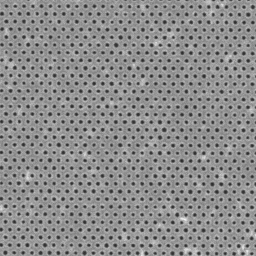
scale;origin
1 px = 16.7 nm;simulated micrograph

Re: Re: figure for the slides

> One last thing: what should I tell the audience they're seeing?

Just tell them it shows a regular array of holes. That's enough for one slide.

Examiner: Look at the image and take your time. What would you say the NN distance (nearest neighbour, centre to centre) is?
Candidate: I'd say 143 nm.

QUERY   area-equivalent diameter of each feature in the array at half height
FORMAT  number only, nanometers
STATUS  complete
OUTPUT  68